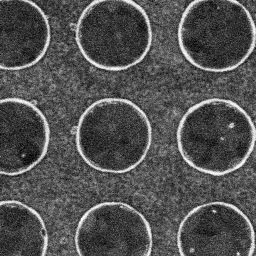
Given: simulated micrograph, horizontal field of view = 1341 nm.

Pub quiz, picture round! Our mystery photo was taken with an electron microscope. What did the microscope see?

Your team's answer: raised bodies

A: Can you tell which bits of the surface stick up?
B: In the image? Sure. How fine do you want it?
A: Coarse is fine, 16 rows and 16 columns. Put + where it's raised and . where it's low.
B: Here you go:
++....+++...+++.
+++..++++..+++++
+++..++++..+++++
+++..++++...+++.
................
................
++....++.....+..
+++..++++..+++++
+++..++++..+++++
+++..++++..+++++
++....++....+++.
................
................
++...++++...+++.
+++..++++..+++++
+++..++++..+++++